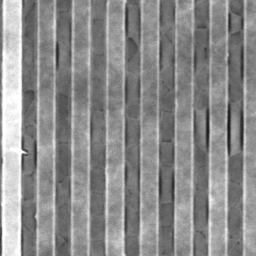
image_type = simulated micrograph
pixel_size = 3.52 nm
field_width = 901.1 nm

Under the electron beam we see parallel lines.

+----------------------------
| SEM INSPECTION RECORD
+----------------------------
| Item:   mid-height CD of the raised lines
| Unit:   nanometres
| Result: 61.6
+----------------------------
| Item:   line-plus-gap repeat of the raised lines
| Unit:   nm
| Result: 121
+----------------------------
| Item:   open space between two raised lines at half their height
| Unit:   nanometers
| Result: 58.5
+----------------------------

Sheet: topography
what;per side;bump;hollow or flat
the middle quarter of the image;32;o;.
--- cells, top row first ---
..oooo.....oooo....ooooo....oooo
..oooo.....oooo....ooooo....oooo
..oooo.....oooo....ooooo....oooo
..oooo.....oooo....ooooo....oooo
..oooo.....oooo....ooooo....oooo
..oooo.....oooo....ooooo....oooo
..oooo.....oooo....ooooo....oooo
..oooo.....oooo....ooooo....oooo
..oooo.....oooo....ooooo....oooo
..oooo.....oooo....ooooo....oooo
..oooo.....oooo....ooooo....oooo
..oooo.....oooo....ooooo....oooo
..oooo.....oooo....ooooo....oooo
..oooo.....oooo....ooooo....oooo
..oooo.....oooo....ooooo....oooo
..oooo.....oooo....ooooo....oooo
..oooo.....oooo....ooooo....oooo
..oooo.....oooo....ooooo....oooo
..oooo.....oooo....ooooo....oooo
..oooo.....oooo....ooooo....oooo
..oooo.....oooo....ooooo....oooo
..oooo.....oooo....oooo.....oooo
..oooo.....oooo....oooo.....oooo
..oooo.....oooo....oooo.....oooo
..oooo.....oooo....oooo.....oooo
..oooo.....oooo....oooo.....oooo
..oooo....ooooo....oooo.....oooo
..oooo....ooooo....oooo.....oooo
..oooo.....oooo....oooo.....oooo
..oooo.....oooo....oooo.....oooo
..oooo.....oooo....oooo.....oooo
..oooo.....oooo....oooo.....oooo